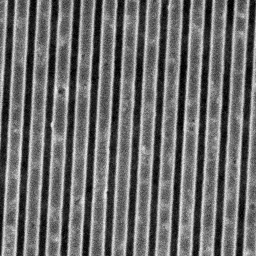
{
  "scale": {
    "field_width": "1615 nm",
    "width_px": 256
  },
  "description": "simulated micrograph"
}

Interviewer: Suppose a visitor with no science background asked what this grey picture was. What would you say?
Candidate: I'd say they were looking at parallel lines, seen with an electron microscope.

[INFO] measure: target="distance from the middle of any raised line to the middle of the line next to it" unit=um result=0.138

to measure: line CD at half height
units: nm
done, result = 85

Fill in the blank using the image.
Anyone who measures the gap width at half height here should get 48.8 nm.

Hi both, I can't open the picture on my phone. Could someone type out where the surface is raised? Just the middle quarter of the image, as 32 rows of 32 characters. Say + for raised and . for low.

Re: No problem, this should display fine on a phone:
+...+++..+++...+++..+++...+++..+
+...+++..+++...+++..+++...+++..+
+...++...+++...+++..+++..++++..+
+...++...+++...+++..+++..++++..+
+..++++..+++...++...+++..++++..+
+..++++..+++..+++...+++..+++...+
+..+++...+++..+++...+++..+++...+
+..+++...+++..+++...+++..+++...+
+..+++...+++..+++...+++..+++...+
+..+++..++++..+++...+++..+++...+
+..+++...+++..+++...+++..+++...+
+..+++..++++..+++..++++..+++...+
+..+++...+++..+++..++++..+++..++
+..+++...+++..+++..++++..+++..++
+..+++..++++..+++..+++...+++..++
...+++..+++...+++..+++...+++..++
...+++..+++...+++..+++...+++..++
...+++..+++...+++..+++...+++..++
...+++..+++...+++..+++...+++..++
...+++..+++...+++..+++...+++..++
...+++..+++...+++..+++...+++..++
...+++..+++...+++..+++..++++..++
..++++..+++..+++...+++..++++..++
..+++...+++..+++...+++..++++..++
..++++..+++..+++...+++..+++...++
..+++...+++..+++...+++..+++...++
..+++...+++..+++...+++..+++...++
..+++...+++..+++...+++..+++...++
..+++...+++..+++...+++..+++...++
..+++...+++..+++...+++..+++...++
..+++...+++..+++..++++..+++...++
..+++...++...+++..++++..+++..+++